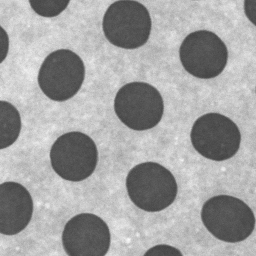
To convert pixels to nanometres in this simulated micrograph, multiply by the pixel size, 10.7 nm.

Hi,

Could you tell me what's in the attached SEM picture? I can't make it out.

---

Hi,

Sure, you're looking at holes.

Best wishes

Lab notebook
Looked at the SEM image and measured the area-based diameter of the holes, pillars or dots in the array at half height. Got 0.526 microns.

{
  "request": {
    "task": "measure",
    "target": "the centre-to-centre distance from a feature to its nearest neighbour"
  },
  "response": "877 nm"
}